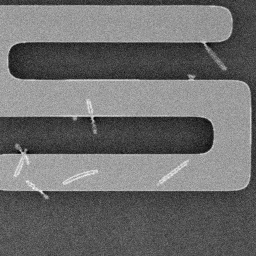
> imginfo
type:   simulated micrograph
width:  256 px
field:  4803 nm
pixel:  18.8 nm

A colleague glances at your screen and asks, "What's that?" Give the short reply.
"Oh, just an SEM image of groups of lines, slits or small figures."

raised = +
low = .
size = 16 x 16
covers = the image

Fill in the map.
++++++++++++++..
++++++++++++++..
++++++++++++++..
+...............
+...............
+++++++++++++++.
++++++++++++++++
.............+++
.............+++
.............+++
++++++++++++++++
+++++++++++++++.
................
................
................
................